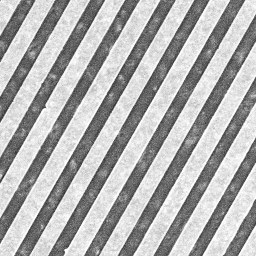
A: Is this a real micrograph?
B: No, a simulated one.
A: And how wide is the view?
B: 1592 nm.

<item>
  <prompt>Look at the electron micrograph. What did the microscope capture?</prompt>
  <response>parallel lines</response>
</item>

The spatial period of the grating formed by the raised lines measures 188 nm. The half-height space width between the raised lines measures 13.8 px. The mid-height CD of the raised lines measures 103 nanometres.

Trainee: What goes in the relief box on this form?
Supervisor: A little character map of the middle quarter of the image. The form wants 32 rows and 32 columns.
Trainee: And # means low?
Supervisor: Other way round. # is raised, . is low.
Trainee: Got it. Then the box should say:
.#####....#####....####....#####
#####....#####....####.....####.
#####....####.....####....#####.
####....#####....####.....####..
###....#####....#####....#####..
###....#####....####....#####...
##....#####....#####....#####...
##....####.....####....#####....
#....#####....####.....####....#
.....####.....####....#####....#
....#####....####.....####....##
...#####....#####....#####....##
...#####....####....#####....###
..#####....#####....#####....###
..#####....####....#####....####
.#####....####.....####....#####
.####.....####....#####....####.
#####....####.....####....#####.
####....#####....#####....####..
####....####....#####....#####..
###....#####....#####....####...
###....####....#####....####....
##....####.....####....#####....
#....#####....#####....####.....
#....####.....####....#####....#
....#####....#####....####....##
....####....#####....#####....##
...#####....#####....####....###
...####....#####....####.....###
..####.....####....#####....####
.#####....#####....####.....####
.####.....####....#####....#####